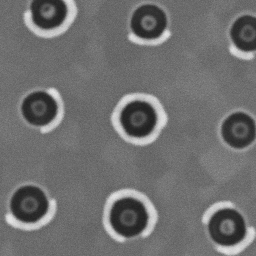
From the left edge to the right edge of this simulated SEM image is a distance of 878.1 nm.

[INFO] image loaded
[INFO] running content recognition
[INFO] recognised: ring-shaped grooves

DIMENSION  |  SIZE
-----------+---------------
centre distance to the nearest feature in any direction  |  336 nm